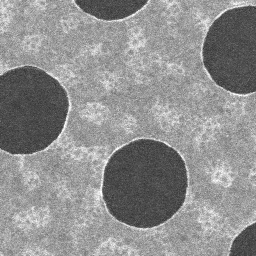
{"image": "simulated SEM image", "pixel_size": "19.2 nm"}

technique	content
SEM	holes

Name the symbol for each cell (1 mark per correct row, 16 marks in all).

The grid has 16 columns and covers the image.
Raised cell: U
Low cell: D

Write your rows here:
UUUUUDDDDUUUUUUD
UUUUUUUUUUUUUDDD
UUUUUUUUUUUUUDDD
UUUUUUUUUUUUUDDD
DDDUUUUUUUUUUDDD
DDDDUUUUUUUUUUDD
DDDDUUUUUUUUUUUU
DDDDUUUUUUUUUUUU
DDDDUUUUUUUUUUUU
DDUUUUUDDDDUUUUU
UUUUUUUDDDDDUUUU
UUUUUUDDDDDDUUUU
UUUUUUDDDDDDUUUU
UUUUUUUDDDDUUUUU
UUUUUUUUUUUUUUUD
UUUUUUUUUUUUUUDD